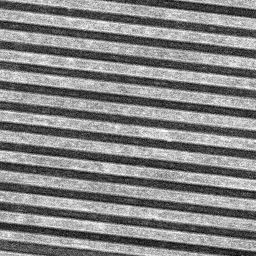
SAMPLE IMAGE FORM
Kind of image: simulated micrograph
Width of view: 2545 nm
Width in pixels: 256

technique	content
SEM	parallel lines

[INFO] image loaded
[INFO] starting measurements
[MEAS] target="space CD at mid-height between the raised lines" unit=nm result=93.8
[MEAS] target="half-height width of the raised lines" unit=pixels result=10.3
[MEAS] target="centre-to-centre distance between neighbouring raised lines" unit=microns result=0.198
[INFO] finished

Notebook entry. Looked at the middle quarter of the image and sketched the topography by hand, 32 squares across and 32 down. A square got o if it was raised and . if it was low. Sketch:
ooooooooooooooooooo.............
.....ooooooooooooooooooooooo....
..............oooooooooooooooooo
......................oooooooooo
ooooooooo......................o
oooooooooooooooooo..............
.....ooooooooooooooooooooo......
..............oooooooooooooooooo
o......................ooooooooo
ooooooooo......................o
oooooooooooooooooo..............
......ooooooooooooooooooooo.....
..............oooooooooooooooooo
.......................ooooooooo
oooooooo........................
ooooooooooooooooo...............
....ooooooooooooooooooooo.......
.............ooooooooooooooooooo
......................oooooooooo
oooooooo......................oo
ooooooooooooooooo...............
.....ooooooooooooooooooooo......
.............ooooooooooooooooooo
......................oooooooooo
ooooooooo.....................oo
ooooooooooooooooo...............
...ooooooooooooooooooooooo......
............oooooooooooooooooooo
.....................ooooooooooo
ooooooo......................ooo
oooooooooooooooo................
....oooooooooooooooooooo........